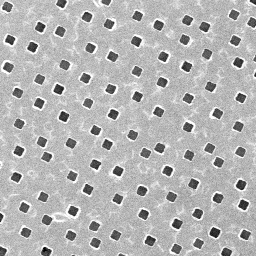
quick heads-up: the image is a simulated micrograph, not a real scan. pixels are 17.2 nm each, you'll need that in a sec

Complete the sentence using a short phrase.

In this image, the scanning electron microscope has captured a regular array of holes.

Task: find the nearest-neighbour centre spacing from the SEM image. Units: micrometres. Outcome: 0.406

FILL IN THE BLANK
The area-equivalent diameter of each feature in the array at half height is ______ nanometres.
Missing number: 183